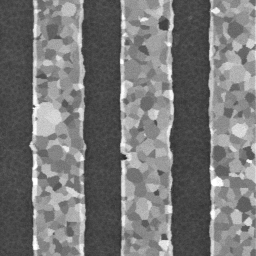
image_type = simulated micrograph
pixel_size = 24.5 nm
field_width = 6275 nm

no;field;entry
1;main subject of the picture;one or a few lines or trenches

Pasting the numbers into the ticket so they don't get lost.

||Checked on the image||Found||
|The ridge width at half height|47.2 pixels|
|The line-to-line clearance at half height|1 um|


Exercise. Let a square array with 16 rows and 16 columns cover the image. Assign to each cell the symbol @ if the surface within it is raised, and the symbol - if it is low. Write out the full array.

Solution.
--@@@---@@@--@@@
--@@@---@@@--@@@
--@@@---@@@--@@@
--@@@---@@@--@@@
--@@@---@@@--@@@
--@@@---@@@--@@@
--@@@---@@@--@@@
--@@@---@@@--@@@
--@@@---@@---@@@
--@@@---@@@--@@@
--@@@---@@@--@@@
--@@@---@@@--@@@
--@@@---@@@--@@@
--@@@---@@@--@@@
--@@@---@@@--@@@
--@@@---@@@--@@@